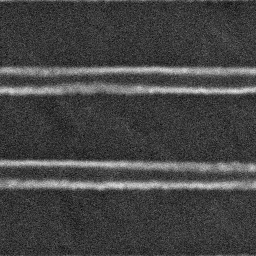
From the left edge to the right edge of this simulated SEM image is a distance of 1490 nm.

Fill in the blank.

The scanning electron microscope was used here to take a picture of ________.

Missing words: lines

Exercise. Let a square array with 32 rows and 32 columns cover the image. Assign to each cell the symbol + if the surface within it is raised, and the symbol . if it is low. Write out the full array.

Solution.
................................
................................
................................
................................
................................
................................
................................
................................
................................
++++++++++++++++++++++++++++++++
++++++++++++++++++++++++++++++++
................................
................................
................................
................................
................................
................................
................................
................................
................................
++++++++++++....................
++++++++++++++++++++++++++++++++
++++++++++++++++++++++++++++++++
................................
................................
................................
................................
................................
................................
................................
................................
................................